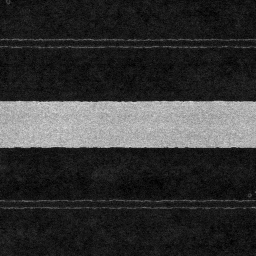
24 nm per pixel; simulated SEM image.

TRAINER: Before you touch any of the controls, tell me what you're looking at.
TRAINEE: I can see lines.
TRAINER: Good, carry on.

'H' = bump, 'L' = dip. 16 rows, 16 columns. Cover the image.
LLLLLLLLLLLLLLLL
LLLLLLLLLLLLLLLL
LLLLLHLLLLLLLLLL
LLLLLLLLLLLLLLLL
LLLLLLLLLLLLLLLL
LLLLLLLLLLLLLLLL
HHHHHHHHHHHHHHHH
HHHHHHHHHHHHHHHH
HHHHHHHHHHHHHHHH
LLLLLLLLLLLLLLLL
LLLLLLLLLLLLLLLL
LLLLLLLLLLLLLLLL
LLLLLLLLLLLLLLLL
LLLLLLLLLLLLLLLL
LLLLLLLLLLLLLLLL
LLLLLLLLLLLLLLLL